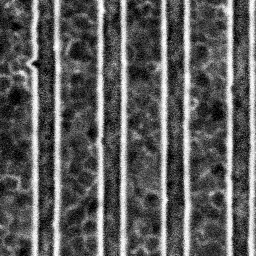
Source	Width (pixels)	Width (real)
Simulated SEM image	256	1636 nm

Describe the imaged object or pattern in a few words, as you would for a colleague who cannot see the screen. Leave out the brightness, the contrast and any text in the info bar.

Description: one or a few lines or trenches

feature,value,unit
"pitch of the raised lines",414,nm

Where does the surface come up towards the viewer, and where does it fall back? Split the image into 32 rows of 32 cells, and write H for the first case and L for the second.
HHHHLLLHHHHHHLLHHHHHLLLHHHHHHLLL
HHHHLLLHHHHHHLLHHHHHLLLHHHHHHLLL
HHHHLLLHHHHHHLLHHHHHLLLHHHHHHLLL
HHHHLLLHHHHHHLLHHHHHLLLHHHHHHLLL
HHHHLLLHHHHHLLLHHHHHLLLHHHHHHLLL
HHHHLLLHHHHHHLLHHHHHHLLHHHHHHLLL
HHHHLLLHHHHHHLLHHHHHHLLHHHHHHLLH
HHHHLLLHHHHHHLLHHHHHHLLHHHHHHLLH
HHHHLLLHHHHHHLLLHHHHHLLHHHHHHLLH
HHHHLLLHHHHHHLLLHHHHHLLHHHHHHLLH
HHHHLLLHHHHHHLLLHHHHHLLHHHHHHLLL
HHHHLLLHHHHHHLLLHHHHHLLHHHHHHLLL
HHHHLLLHHHHHHLLLHHHHHLLHHHHHHLLL
HHHHLLLHHHHHHLLLHHHHLLLHHHHHHLLL
HHHHLLLHHHHHHLLLHHHHLLLHHHHHHLLL
HHHHLLLHHHHHHLLLHHHHLLLHHHHHHLLL
HHHHLLLHHHHHHLLLHHHHLLLHHHHHHLLL
HHHHLLLHHHHHLLLLHHHHHLLHHHHHHLLL
HHHHLLLHHHHHHLLLHHHHHLLHHHHHHLLL
HHHHLLLHHHHHHLLLHHHHLLLHHHHHHLLL
HHHHLLLHHHHHHLLHHHHHHLLHHHHHHLLL
HHHHLLLHHHHHHLLHHHHHHLLHHHHHHLLL
HHHHLLLHHHHHHLLHHHHHHLLHHHHHHLLL
HHHHLLLHHHHHHLLHHHHHLLLHHHHHHLLH
HHHHLLLHHHHHHLLHHHHHHLLHHHHHHLLH
HHHHLLLHHHHHHLLHHHHHHLLHHHHHHLLH
HHHHLLLHHHHHHLLHHHHHLLLHHHHHHLLH
HHHHLLLHHHHHHLLHHHHHLLLHHHHHHLLH
HHHHLLLHHHHHHLLHHHHHLLLHHHHHHLLH
HHHHLLLHHHHHHLLHHHHHLLLHHHHHHLLH
HHHHLLLHHHHHHLLHHHHHLLLHHHHHHLLH
HHHHLLLHHHHHHLLHHHHHLLLHHHHHHLLH